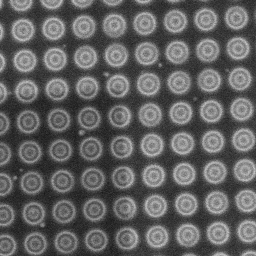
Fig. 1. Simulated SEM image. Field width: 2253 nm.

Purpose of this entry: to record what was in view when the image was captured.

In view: an array of small figures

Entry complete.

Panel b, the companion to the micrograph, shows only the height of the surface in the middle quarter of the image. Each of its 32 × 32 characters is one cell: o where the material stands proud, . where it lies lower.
oooo..oooooooooooooooooooooooooo
oooooooooooooooooooooooooooooooo
oooooooooooooooooooooooooooo..oo
oooooooooooo...oooo....oooo....o
oooo....ooo.....ooo.....oo.....o
oooo....ooo.....ooo....ooo.....o
.ooo....ooo.....ooo....oooo...oo
oooo....oooo...ooooooooooooooooo
oooooooooooooooooooooooooooooooo
oooooooooooooooooooooooooooooooo
ooooooooooooooooooooo..ooooo...o
ooooo..ooooo....ooo.....ooo....o
oooo....oooo....ooo.....ooo.....
.ooo.....ooo....ooo.....ooo....o
.ooo....oooo....oooo...ooooo..oo
ooooo...oooooooooooooooooooooooo
oooooooooooooooooooooooooooooooo
oooooooooooooooooooooooooooooooo
oooooooooooooo.ooooo....oooo...o
ooooo...ooooo...oooo....ooo.....
.ooo.....ooo.....ooo....ooo.....
.ooo.....ooo.....ooo....oooo...o
.oooo....oooo...ooooo..ooooooooo
oooooo..oooooooooooooooooooooooo
oooooooooooooooooooooooooooooooo
ooooooooooooooooooooooooooooo..o
ooooooo.ooooo...ooooo...oooo....
.oooo....oooo....ooo.....ooo....
..ooo.....oo.....ooo.....ooo....
..ooo.....ooo....oooo...ooooo..o
..ooo....ooooo..oooooooooooooooo
oooooooooooooooooooooooooooooooo